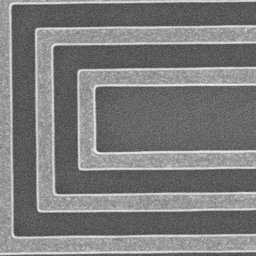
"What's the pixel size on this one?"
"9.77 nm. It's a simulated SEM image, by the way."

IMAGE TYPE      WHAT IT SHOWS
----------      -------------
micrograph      groups of lines, slits or small figures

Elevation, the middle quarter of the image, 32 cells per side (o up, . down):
................................
....oooooooooooooooooooooooooooo
....oooooooooooooooooooooooooooo
....oooooooooooooooooooooooooooo
....oooooooooooooooooooooooooooo
....ooooo.......................
....oooo........................
....ooo.........................
....ooo.........................
....ooo.........................
....oooo........................
....oooo........................
....oooo........................
....oooo........................
....oooo........................
....oooo........................
....oooo........................
....oooo........................
....oooo........................
....oooo........................
....oooo........................
....oooo........................
....oooooooooooooooooooooooooooo
....oooooooooooooooooooooooooooo
....oooooooooooooooooooooooooooo
....oooooooooooooooooooooooooooo
................................
................................
................................
................................
................................
................................